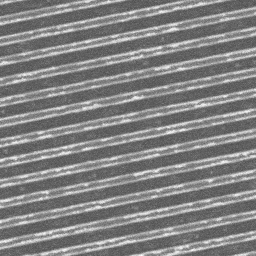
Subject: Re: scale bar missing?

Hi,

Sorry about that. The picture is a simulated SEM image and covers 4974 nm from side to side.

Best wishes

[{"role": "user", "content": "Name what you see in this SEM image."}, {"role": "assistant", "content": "parallel lines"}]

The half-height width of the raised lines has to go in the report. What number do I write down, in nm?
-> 143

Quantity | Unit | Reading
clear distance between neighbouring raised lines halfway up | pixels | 12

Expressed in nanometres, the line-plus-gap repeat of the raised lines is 388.